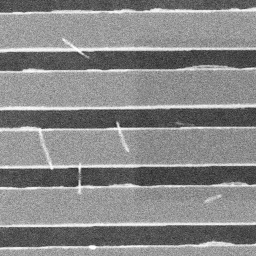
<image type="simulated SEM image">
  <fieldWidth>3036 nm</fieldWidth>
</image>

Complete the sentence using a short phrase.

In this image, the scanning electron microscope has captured lines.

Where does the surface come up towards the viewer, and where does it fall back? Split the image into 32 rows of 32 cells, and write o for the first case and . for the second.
................................
...........ooooooooooooooooooooo
oooooooooooooooooooooooooooooooo
oooooooooooooooooooooooooooooooo
oooooooooooooooooooooooooooooooo
oooooooooooooooooooooooooooooooo
................................
................................
................................
oooooooooooooooooooooooooooooooo
oooooooooooooooooooooooooooooooo
oooooooooooooooooooooooooooooooo
oooooooooooooooooooooooooooooooo
ooooooooooooooooo...............
................................
................................
oooooooooooooooooooooooooooooooo
oooooooooooooooooooooooooooooooo
oooooooooooooooooooooooooooooooo
oooooooooooooooooooooooooooooooo
oooooooooooooooooooooooooooooooo
................................
................................
oo.ooooooooooooooooooooooooooooo
oooooooooooooooooooooooooooooooo
oooooooooooooooooooooooooooooooo
oooooooooooooooooooooooooooooooo
oooooooooooooooooooooooooooooooo
................................
................................
................................
oooooooooooooooooooooooooooooooo